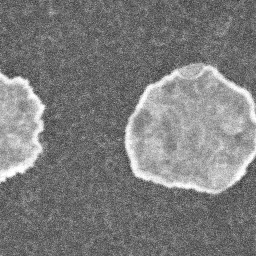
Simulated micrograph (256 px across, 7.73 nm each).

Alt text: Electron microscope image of raised bodies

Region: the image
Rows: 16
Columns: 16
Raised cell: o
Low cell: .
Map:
................
................
................
................
................
oo.......oooooo.
oo.......ooooooo
oo......oooooooo
oo......oooooooo
oo......oooooooo
o.......ooooooo.
..........oooo..
................
................
................
................